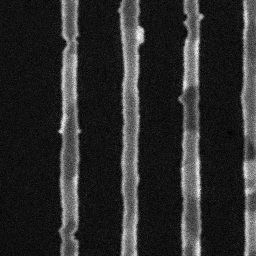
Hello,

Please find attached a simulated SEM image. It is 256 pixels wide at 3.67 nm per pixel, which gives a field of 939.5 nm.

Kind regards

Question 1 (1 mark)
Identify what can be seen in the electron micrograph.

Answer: parallel lines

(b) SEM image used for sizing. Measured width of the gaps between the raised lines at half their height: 168 nm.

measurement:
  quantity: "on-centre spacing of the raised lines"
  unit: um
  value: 0.223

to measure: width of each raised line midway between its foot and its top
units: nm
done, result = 55.2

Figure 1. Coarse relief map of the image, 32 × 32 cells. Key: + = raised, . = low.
........++.....++......++......+
........++.....++......++......+
........++.....++......++......+
........++.....+++.....++......+
........++.....+++.....++.....++
........++.....+++.....++.....++
........++.....++......++.....++
........++......+......++.....++
........++......+......++.....++
........++......+......++.....++
........+......++......++.....++
........+......++......++.....++
........++.....++.....+++.....++
........++.....++......++.....++
........++.....++......++.....++
........++......+......++......+
........++.....++......++......+
........++.....++......++......+
........++.....++......++......+
........++.....++......++......+
........++.....++......++.....++
........++.....++......++.....++
........++.....++......++......+
........++.....++......++......+
........++.....++......++......+
........++.....++......++......+
........++.....++......++......+
........++.....++......++......+
........++.....++......++......+
........+......++......++......+
........++.....++......++......+
........++.....++......++......+